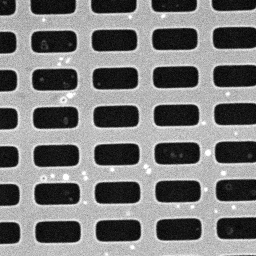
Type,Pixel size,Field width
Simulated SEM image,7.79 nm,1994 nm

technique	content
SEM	groups of lines, slits or small figures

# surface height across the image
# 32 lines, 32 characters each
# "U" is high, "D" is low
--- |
DDUUDDDDDDUDDDDDDUUDDDDDDUUDDDDD
DDUUDDDDDUUUDDDDUUUUDDDUUUUUUUUU
UUUUUUUUUUUUUUUUUUUUUUUUUUUUUUUU
UUUUUUUUUUUUUUUUUUUUUUDDUUUDDDDD
DDUUDDDDDDUDDDDDDUUDDDDDDUUDDDDD
DDUUDDDDDDUDDDDDDUUDDDDDDUUDDDDD
DDUUDDDDDUUUUUUUUUUUUUUUUUUUUUUU
UUUUUUUUUUUUUUUUUUUUUUUUUUUUUUUU
UUUUUUUDDUUUDDDDDUUUDDDDUUUDDDDD
DDUUDDDDDDUUDDDDDUUDDDDDDUUDDDDD
DDUUDDDDDDUUDDDDDUUDDDDDDUUDDDDD
DUUUUUUUUUUUUUUUUUUUUUUUUUUUUUUU
UUUUUUUUUUUUUUUUUUUUUUUUUUUUUUUU
DUUUUDDDDUUUDDDDDUUDDDDDDUUDDDDD
DDUUDDDDDDUUDDDDDUUDDDDDDUUDDDDD
DDUUDDDDDDUUDDDDDUUUDDDDDUUDDDDD
UUUUUUUUUUUUUUUUUUUUUUUUUUUUUUUU
UUUUUUUUUUUUUUUUUUUUUUUUUUUUUUUU
DDUUDDDDDDUUDDDDDUUDDDDDDUUDDDDD
DDUUDDDDDDUUDDDDDUUDDDDDDUUDDDDD
DDUUDDDDDDUUDDDDDUUUDDDDUUUUUUUU
UUUUUUUUUUUUUUUUUUUUUUUUUUUUUUUU
UUUUUUUUUUUUUUUUUUUUUDDDUUUUDDDD
DDUUDDDDDDUUDDDDDUUDDDDDDUUDDDDD
DDDUDDDDDDUUDDDDDUUDDDDDDUUDDDDD
DDUUUDDDDUUUUDDDUUUUUUUUUUUUUUUU
UUUUUUUUUUUUUUUUUUUUUUUUUUUUUUUU
UUUUUUUUUUUUUDDDDUUUDDDDDUUDDDDD
DDUUDDDDDDUUDDDDDDUUDDDDDUUDDDDD
DDDUDDDDDDUUDDDDDDUUDDDDDUUDDDDD
DUUUUUUUUUUUUUUUUUUUUUUUUUUUUUUU
UUUUUUUUUUUUUUUUUUUUUUUUUUUUUUUU